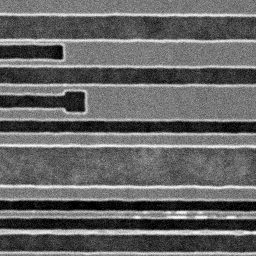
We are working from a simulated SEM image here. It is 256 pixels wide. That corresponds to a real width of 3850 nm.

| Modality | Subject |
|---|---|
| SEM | groups of lines, slits or small figures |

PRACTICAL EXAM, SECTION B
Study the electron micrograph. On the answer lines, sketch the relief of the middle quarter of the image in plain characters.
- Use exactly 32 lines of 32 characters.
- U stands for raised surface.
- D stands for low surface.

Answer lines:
UUUUUUUUUUUUUUUUUUUUUUUUUUUUUUUU
DDDDDDDDDDDDDDDDDDDDDDDDDDDDDDDD
DDDDDDDDDDDDDDDDDDDDDDDDDDDDDDDD
DDDDDDDDDDDDDDDDDDDDDDDDDDDDDDDD
DDDDDDDDDDDDDDDDDDDDDDDDDDDDDDDD
UUUUUUUUUUUUUUUUUUUUUUUUUUUUDDUU
UUUUUUUUUUUUUUUUUUUUUUUUUUUUUUUU
DDDDDDUUUUUUUUUUUUUUUUUUUUUUUUUU
DDDDDDUUUUUUUUUUUUUUUUUUUUUUUUUU
DDDDDDUUUUUUUUUUUUUUUUUUUUUUUUUU
DDDDDDUUUUUUUUUUUUUUUUUUUUUUUUUU
DDDDDDUUUUUUUUUUUUUUUUUUUUUUUUUU
UUUUUUUUUUUUUUUUUUUUUUUUUUUUUUUU
UUUUUUUUUUUUUUUUUUUUUUUUUUUUUUUU
DDDDDDDDDDDDDDDDDDDDDDDDDDDDDDDD
DDDDDDDDDDDDDDDDDDDDDDDDDDDDDDDD
DDDDDDDDDDDDDDDDDDDDDDDDDDDDDDDD
UUUUUUUUDDUUUDDDDDDDDDDUUUUDDDDD
UUUUUUUUUUUUUUUUUUUUUUUUUUUUUUUU
UUUUUUUUUUUUUUUUUUUUUUUUUUUUUUUU
UDDUUUUUUDDDDUUUUUUDUUUUUUUUUUUU
DDDDDDDDDDDDDDDDDDDDDDDDDDDDDDDD
DDDDDDDDDDDDDDDDDDDDDDDDDDDDDDDD
DDDDDDDDDDDDDDDDDDDDDDDDDDDDDDDD
DDDDDDDDDDDDDDDDDDDDDDDDDDDDDDDD
DDDDDDDDDDDDDDDDDDDDDDDDDDDDDDDD
DDDDDDDDDDDDDDDDDDDDDDDDDDDDDDDD
DDDDDDDDDDDDDDDDDDDDDDDDDDDDDDDD
DDDDDDDDDDDDDDDDDDDDDDDDDDDDDDDD
DDDDDDDDDDDDDDDDDDDDDDDDDDDDDDDD
DDDDDDDDDDDDDDDDDDDDDDDDDDDDDDDD
UUUUUUUUUUUUUUUUUUUUUUUUUUUUUUUU